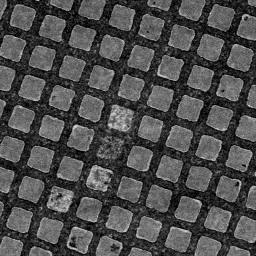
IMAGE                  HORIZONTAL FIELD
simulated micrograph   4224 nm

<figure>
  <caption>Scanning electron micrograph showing a regular array of raised bodies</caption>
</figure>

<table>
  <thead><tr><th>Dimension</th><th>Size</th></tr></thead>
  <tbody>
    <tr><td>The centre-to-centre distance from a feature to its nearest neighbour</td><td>0.51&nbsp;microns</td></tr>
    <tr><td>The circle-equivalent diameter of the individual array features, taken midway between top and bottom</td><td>0.4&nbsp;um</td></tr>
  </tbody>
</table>